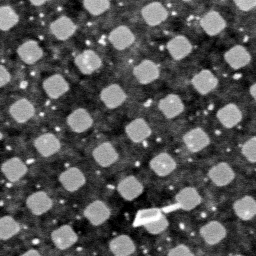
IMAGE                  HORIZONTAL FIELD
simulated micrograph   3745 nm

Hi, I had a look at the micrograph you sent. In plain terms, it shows a regular array of raised bodies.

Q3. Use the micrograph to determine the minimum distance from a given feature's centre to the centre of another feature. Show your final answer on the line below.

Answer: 597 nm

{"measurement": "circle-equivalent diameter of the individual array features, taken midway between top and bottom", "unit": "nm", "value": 323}